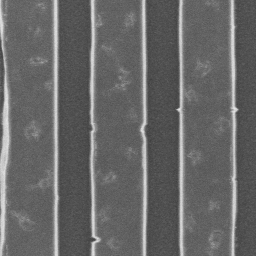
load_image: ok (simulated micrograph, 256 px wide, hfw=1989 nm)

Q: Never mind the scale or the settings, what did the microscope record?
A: one or a few lines or trenches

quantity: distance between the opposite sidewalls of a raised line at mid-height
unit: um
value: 0.412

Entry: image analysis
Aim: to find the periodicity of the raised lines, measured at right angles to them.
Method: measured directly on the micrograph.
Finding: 689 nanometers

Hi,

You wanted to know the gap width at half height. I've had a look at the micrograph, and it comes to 36 pixels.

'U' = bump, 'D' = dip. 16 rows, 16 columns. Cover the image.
UUUDDDUUUDDUUUDD
UUUDDDUUUDDUUUUD
UUUDDDUUUDDUUUUD
UUUDDDUUUDDUUUUD
UUUDDDUUUDDUUUUD
UUUDDDUUUDDUUUUD
UUUDDDUUUDDUUUUD
UUUDDDUUUDDUUUUD
UUUDDDUUUDDUUUUD
UUUDDDUUUDDUUUUD
UUUDDDUUUDDUUUUD
UUUDDDUUUDDUUUUD
UUUUDDUUUDDUUUUD
UUUDDDUUUDDUUUUD
UUUDDDUUUDDUUUUD
UUUDDDUUUDDUUUUD